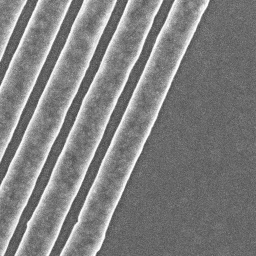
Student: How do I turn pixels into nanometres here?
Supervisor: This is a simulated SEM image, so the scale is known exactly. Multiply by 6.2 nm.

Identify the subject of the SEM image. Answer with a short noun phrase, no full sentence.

parallel lines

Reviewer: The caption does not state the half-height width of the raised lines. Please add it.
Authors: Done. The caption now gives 186 nm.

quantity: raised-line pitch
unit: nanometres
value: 258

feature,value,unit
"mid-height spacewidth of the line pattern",71.5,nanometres